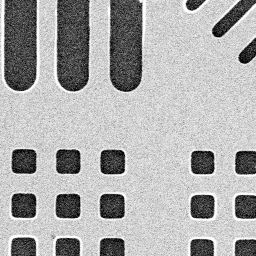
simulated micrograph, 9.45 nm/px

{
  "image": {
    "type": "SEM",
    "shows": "groups of lines, slits or small figures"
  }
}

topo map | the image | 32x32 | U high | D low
DDDDDUUDDDDUUUDDDDUUUUUDDUUUUDDD
DDDDDUUDDDDUUUDDDDUUUUUUUUUUDDDU
DDDDDUUDDDDUUUDDDDUUUUUUUUUDDDUU
DDDDDUUDDDDUUUDDDDUUUUUUUUUDDUUU
DDDDDUUDDDDUUUDDDDUUUUUUUUUDUUUU
DDDDDUUDDDDUUUDDDDUUUUUUUUUUUUUD
DDDDDUUDDDDUUUDDDDUUUUUUUUUUUUDD
DDDDDUUDDDDUUUDDDDUUUUUUUUUUUUDU
DDDDDUUDDDDUUUDDDDUUUUUUUUUUUUUU
DDDDDUUDDDDUUUDDDDUUUUUUUUUUUUUU
UDDDUUUDDDDUUUDDDUUUUUUUUUUUUUUU
UUDUUUUUUDUUUUUDUUUUUUUUUUUUUUUU
UUUUUUUUUUUUUUUUUUUUUUUUUUUUUUUU
UUUUUUUUUUUUUUUUUUUUUUUUUUUUUUUU
UUUUUUUUUUUUUUUUUUUUUUUUUUUUUUUU
UUUUUUUUUUUUUUUUUUUUUUUUUUUUUUUU
UUUUUUUUUUUUUUUUUUUUUUUUUUUUUUUU
UUUUUUUUUUUUUUUUUUUUUUUUUUUUUUUU
UUUUUUUUUUUUUUUUUUUUUUUUUUUUUUUU
UDDDDUUDDDUUUDDDUUUUUUUUDDDUUDDD
UDDDDUUDDDUUDDDDUUUUUUUUDDDUUDDD
UUDDUUUDDDUUUDDDUUUUUUUUDDDUUDDD
UUUUUUUUUUUUUUUUUUUUUUUUUUUUUUUU
UUUUUUUUUUUUUUUUUUUUUUUUUUUUUUUU
UUDDUUUDDDUUUDDUUUUUUUUUDDDUUUDD
UDDDDUUDDDUUDDDDUUUUUUUUDDDUUDDD
UDDDDUUDDDUUDDDDUUUUUUUUDDDUUDDD
UUUUUUUUUUUUUUUUUUUUUUUUUUUUUUUU
UUUUUUUUUUUUUUUUUUUUUUUUUUUUUUUU
UUDUUUUUUUUUUUUUUUUUUUUUUUUUUUUU
UDDDDUUDDDUUDDDDUUUUUUUUDDDUUDDD
UDDDDUUDDDUUDDDDUUUUUUUUDDDUUDDD